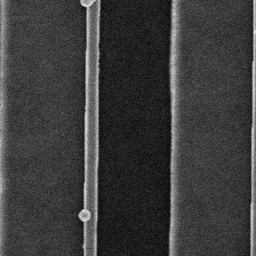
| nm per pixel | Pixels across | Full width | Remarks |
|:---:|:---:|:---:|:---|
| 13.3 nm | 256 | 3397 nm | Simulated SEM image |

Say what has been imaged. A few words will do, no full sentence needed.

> lines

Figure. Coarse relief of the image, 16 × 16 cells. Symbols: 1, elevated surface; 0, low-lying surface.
1111110000011111
1111110000011111
1111110000011111
1111110000011111
1111110000011111
1111110000011111
1111110000011111
1111110000011111
1111110000011111
1111110000011111
1111110000011111
1111110000011111
1111110000011111
1111110000011111
1111110000011111
1111110000011111